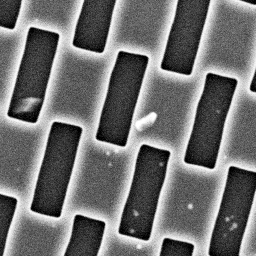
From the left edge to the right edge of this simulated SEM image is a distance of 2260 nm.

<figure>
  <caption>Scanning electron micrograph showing groups of lines, slits or small figures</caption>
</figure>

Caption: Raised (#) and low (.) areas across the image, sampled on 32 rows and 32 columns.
...#######.....#######....#####.
...#######....########....######
..########....########....######
..##.####.....#######.....######
###....##.....#######....#######
###....##....########....#######
###....#####.##.#####....#######
###....#######.....#....########
##.....#######....##....########
##....########....########..####
##....#######.....#######.....#.
##....#######.....#######....###
#.....#######....########....###
#....########....########....###
#....#######.....#######....####
#######..###....########....####
######....##....########....####
######....##....########....####
######....#######...###.....####
#####.....#######....##....#####
#####....########....##....#####
#####....########....#######....
#####....#######.....#######....
####.....#######....########....
.###....########....########....
..##....########....########....
..##....#######.....#######....#
..#######....##....########....#
.########....##....########....#
.########....##....#######.....#
.#######.....#######....##....##
.#######....########....##....##